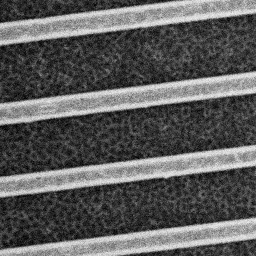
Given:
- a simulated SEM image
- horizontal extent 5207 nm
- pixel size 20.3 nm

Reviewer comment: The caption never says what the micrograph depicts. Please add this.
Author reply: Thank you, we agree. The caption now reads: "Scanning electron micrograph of one or a few lines or trenches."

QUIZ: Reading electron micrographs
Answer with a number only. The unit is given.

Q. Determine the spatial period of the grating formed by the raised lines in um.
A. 1.52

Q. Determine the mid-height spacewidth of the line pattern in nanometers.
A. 1170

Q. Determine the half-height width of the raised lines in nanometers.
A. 318